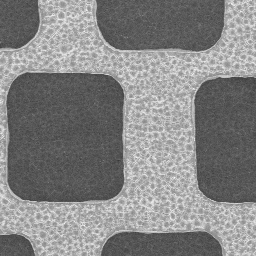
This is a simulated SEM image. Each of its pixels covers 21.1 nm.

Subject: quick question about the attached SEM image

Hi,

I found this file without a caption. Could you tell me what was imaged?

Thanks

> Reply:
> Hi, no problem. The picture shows holes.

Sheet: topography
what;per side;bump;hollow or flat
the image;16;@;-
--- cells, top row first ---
--@@@@--------@@
--@@@@--------@@
--@@@@@-------@@
@@@@@@@@@@@@@@@@
@@@@@@@@@@@@@@@@
@-------@@@@----
--------@@@@----
--------@@@@----
--------@@@@----
--------@@@@----
--------@@@@----
@-------@@@@----
@@-----@@@@@@---
@@@@@@@@@@@@@@@@
@@@@@@@@-@@--@@@
--@@@@--------@@